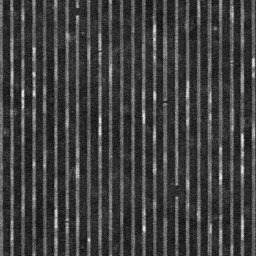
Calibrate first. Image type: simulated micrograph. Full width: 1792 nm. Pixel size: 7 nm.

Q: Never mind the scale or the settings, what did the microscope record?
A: parallel lines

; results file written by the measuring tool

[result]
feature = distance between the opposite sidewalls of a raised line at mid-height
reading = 17.5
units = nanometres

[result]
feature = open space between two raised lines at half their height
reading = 0.0603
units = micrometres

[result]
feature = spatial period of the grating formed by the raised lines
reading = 76.9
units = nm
